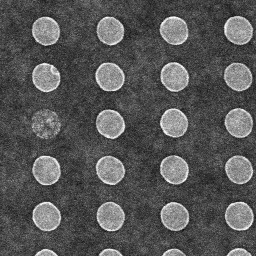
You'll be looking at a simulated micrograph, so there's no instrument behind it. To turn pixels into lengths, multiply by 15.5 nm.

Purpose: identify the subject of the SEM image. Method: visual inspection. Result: a regular array of raised bodies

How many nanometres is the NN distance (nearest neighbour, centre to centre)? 714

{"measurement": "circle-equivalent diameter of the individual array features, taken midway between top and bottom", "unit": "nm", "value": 431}